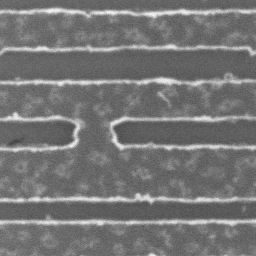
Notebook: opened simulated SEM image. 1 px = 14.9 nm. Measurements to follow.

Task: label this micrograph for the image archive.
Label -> one or a few lines or trenches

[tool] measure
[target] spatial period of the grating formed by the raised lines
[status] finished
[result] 1070 nm